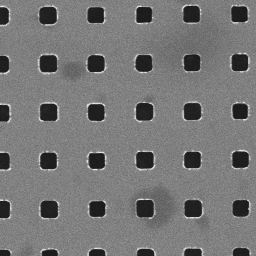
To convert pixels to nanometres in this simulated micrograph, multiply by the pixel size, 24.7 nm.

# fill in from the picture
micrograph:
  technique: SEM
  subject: a regular array of holes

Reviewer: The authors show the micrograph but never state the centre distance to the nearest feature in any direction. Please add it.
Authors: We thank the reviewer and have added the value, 1180 nm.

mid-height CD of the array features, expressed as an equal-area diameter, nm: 460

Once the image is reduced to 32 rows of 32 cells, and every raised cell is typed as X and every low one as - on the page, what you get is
XXXXXXXXXXXXXXXXXXXXXXXXXXXXXXXX
-XXXX--XXXX--XXXX--XXXX--XXXX--X
-XXXX--XXXX--XXXX--XXXX--XXXX--X
XXXXXXXXXXXXXXXXXXXXXXXXXXXXXXXX
XXXXXXXXXXXXXXXXXXXXXXXXXXXXXXXX
XXXXXXXXXXXXXXXXXXXXXXXXXXXXXXXX
XXXXXXXXXXXXXXXXXXXXXXXXXXXXXXXX
-XXXX--XXXX--XXXX--XXXX--XXXX--X
-XXXX--XXXX--XXXX--XXXX--XXXX--X
XXXXXXXXXXXXXXXXXXXXXXXXXXXXXXXX
XXXXXXXXXXXXXXXXXXXXXXXXXXXXXXXX
XXXXXXXXXXXXXXXXXXXXXXXXXXXXXXXX
XXXXXXXXXXXXXXXXXXXXXXXXXXXXXXXX
-XXXX--XXXX--XXXX--XXXX--XXXX--X
-XXXX--XXXX--XXXX--XXXX--XXXX--X
XXXXXXXXXXXXXXXXXXXXXXXXXXXXXXXX
XXXXXXXXXXXXXXXXXXXXXXXXXXXXXXXX
XXXXXXXXXXXXXXXXXXXXXXXXXXXXXXXX
XXXXXXXXXXXXXXXXXXXXXXXXXXXXXXXX
-XXXX--XXXX--XXXX--XXXX--XXXX--X
-XXXX--XXXX--XXXX--XXXX--XXXX--X
XXXXXXXXXXXXXXXXXXXXXXXXXXXXXXXX
XXXXXXXXXXXXXXXXXXXXXXXXXXXXXXXX
XXXXXXXXXXXXXXXXXXXXXXXXXXXXXXXX
XXXXXXXXXXXXXXXXXXXXXXXXXXXXXXXX
-XXXX--XXXX--XXXX--XXXX--XXXX--X
-XXXX--XXXX--XXXX--XXXX--XXXX--X
XXXXXXXXXXXXXXXXXXXXXXXXXXXXXXXX
XXXXXXXXXXXXXXXXXXXXXXXXXXXXXXXX
XXXXXXXXXXXXXXXXXXXXXXXXXXXXXXXX
XXXXXXXXXXXXXXXXXXXXXXXXXXXXXXXX
-XXXX--XXXX--XXXX--XXXX--XXXX--X